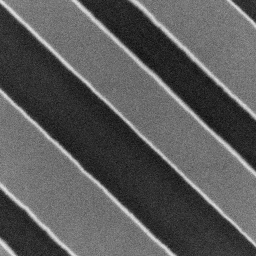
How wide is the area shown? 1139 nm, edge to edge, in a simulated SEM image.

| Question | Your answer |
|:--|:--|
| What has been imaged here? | lines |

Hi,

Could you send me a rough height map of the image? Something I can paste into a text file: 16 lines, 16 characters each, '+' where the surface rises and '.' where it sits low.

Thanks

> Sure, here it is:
.++++....++++++.
..++++....++++++
...++++....+++++
....++++....++++
.....++++....+++
......++++....++
+......++++....+
++......++++....
+++......+++++..
++++......+++++.
+++++......+++++
++++++......++++
.++++++......+++
..++++++......++
...++++++......+
....++++++......